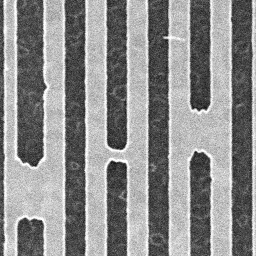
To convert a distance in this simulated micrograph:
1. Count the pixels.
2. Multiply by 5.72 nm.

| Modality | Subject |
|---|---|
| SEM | parallel lines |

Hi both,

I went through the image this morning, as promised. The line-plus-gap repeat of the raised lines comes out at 241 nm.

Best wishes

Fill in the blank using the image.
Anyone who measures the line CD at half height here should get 116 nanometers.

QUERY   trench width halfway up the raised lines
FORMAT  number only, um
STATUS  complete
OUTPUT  0.122